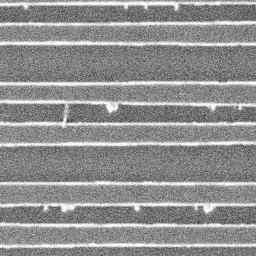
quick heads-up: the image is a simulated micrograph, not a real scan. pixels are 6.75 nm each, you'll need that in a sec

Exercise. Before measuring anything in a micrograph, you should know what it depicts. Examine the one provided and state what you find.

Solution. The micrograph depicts lines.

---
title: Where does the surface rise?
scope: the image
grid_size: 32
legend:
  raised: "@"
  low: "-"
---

@@@@@@@@------------------------
--------------------------------
--------------------------------
@@@@@@@@@@@@@@@@@@@@@@@@@@@@@@@@
@@@@@@@@@@@@@@@@@@@@@@@@@@@@@@@@
-----------------------@@@@@@@--
--------------------------------
--------------------------------
--------------------------------
--------------------------------
@@@@@@@-@-@@@@@@@@@@@@@@@@@@@@@@
@@@@@@@@@@@@@@@@@@@@@@@@@@@@@@@@
@@@@@@@@@@@@@@@@@@@@@@@@@@@@@@@@
--------------------------------
--------------------------------
-------@@-----------------------
@@@@@@@@@@@@@@@@@@@@@@@@@@@@@@@@
@@@@@@@@@@@@@@@@@@@@@@@@@@@@@@@@
--------------------------------
--------------------------------
--------------------------------
--------------------------------
--------------------------------
@@@@@@@@@@@@@@@@@@@@@@@@@@@@@@@@
@@@@@@@@@@@@@@@@@@@@@@@@@@@@@@@@
@@@@@@@@@@@@@@@@@@@@@@@@@@@@@@@@
--------------------------------
--------------------------------
@@@@@@@@@@@@@@@@@@@@@@@@@@@@@@@@
@@@@@@@@@@@@@@@@@@@@@@@@@@@@@@@@
@@@@@@@@@@@@@@@@@@@@@@@@@@@@@@@@
--------------------------------